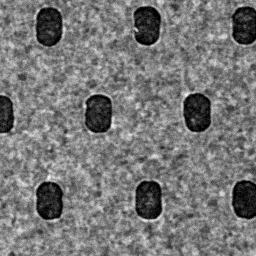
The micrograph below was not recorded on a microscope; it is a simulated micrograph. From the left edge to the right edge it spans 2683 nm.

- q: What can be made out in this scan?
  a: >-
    holes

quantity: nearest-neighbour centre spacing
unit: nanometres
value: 1030